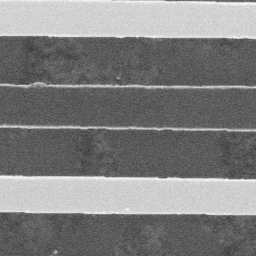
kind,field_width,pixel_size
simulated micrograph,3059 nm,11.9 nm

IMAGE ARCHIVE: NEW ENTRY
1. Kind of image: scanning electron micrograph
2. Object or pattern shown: lines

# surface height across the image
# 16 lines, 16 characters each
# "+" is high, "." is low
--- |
++++++++++++++++
++++++++++++++++
................
................
................
++++++++++++++++
++++++++++++++++
++++++++++++++++
................
................
................
++++++++++++++++
++++++++++++++++
................
................
................